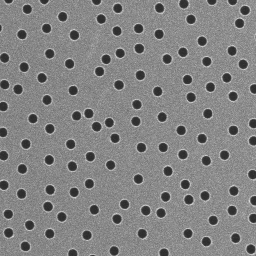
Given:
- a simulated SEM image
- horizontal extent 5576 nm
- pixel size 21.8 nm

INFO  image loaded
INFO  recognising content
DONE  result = a regular array of holes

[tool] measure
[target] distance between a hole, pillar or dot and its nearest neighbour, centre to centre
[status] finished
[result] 436 nm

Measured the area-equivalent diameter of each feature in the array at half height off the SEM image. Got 201 nm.